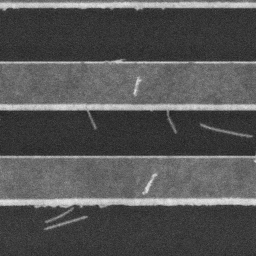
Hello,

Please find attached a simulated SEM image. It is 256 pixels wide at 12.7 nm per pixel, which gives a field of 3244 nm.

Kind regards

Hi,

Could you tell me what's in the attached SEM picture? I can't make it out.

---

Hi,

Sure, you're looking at lines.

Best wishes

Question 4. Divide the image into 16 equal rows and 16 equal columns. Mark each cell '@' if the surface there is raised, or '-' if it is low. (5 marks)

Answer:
----------------
----------------
----------------
----------------
@@@@@@@@@@@@@@@@
@@@@@@@@@@@@@@@@
@@@@@@@@@@@@@@@@
----------------
----------------
----------------
@@@@@@@@@@@@@@@@
@@@@@@@@@@@@@@@@
@@@@@@@@@@@@@@@@
----------------
----------------
----------------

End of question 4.